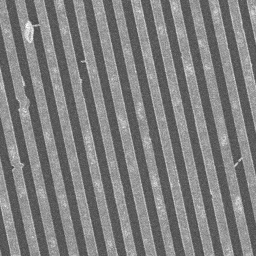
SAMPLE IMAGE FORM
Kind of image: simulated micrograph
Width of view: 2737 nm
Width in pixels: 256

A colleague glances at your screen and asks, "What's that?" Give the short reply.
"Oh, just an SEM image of parallel lines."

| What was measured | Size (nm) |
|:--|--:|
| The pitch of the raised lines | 202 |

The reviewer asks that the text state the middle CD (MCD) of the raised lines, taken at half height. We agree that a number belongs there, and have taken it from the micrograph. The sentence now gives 0.102 µm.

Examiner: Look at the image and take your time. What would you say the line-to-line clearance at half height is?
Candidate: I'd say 102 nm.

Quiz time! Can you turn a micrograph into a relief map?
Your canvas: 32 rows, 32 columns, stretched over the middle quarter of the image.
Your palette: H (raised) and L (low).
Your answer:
LHHLLLHHLLLHHLLLHHLLHHHLLHHLLLHH
LHHLLLHHLLLHHLLLHHLLLHHLLHHHLLHH
LHHHLLHHLLLHHLLLHHLLLHHLLLHHLLHH
LLHHLLLHHLLHHHLLHHLLLHHLLLHHLLLH
LLHHLLLHHLLHHHLLHHHLLHHLLLHHLLLH
LLHHLLLHHLLLHHLLLHHLLHHHLLHHHLLH
LLHHLLLHHLLLHHLLLHHLLLHHLLHHHLLH
LLHHHLLHHLLLHHLLLHHLLLHHLLLHHLLH
LLLHHLLLHHLLHHHLLHHLLLHHLLLHHLLL
LLLHHLLLHHLLHHHLLLHHLLHHLLLHHLLL
HLLHHLLLHHLLLHHLLLHHLLHHHLLHHHLL
HLLHHLLLHHLLLHHLLLHHLLLHHLLHHHLL
HLLLHHLLHHHLLHHLLLHHLLLHHLLLHHLL
HLLLHHLLLHHLLHHHLLHHLLLHHLLLHHLL
HLLLHHLLLHHLLHHHLLLHHLLHHHLLHHLL
HHLLHHLLLHHLLLHHLLLHHLLHHHLLHHHL
HHLLHHHLLHHLLLHHLLLHHLLLHHLLLHHL
HHLLLHHLLHHHLLHHLLLHHLLLHHLLLHHL
HHLLLHHLLLHHLLHHHLLHHLLLHHLLLHHL
HHHLLHHLLLHHLLLHHLLLHHLLHHHLLHHL
HHHLLHHLLLHHLLLHHLLLHHLLHHHLLHHH
LHHLLHHHLLHHLLLHHLLLHHLLLHHLLLHH
LHHLLLHHLLLHHLLHHHLLHHLLLHHLLLHH
LHHLLLHHLLLHHLLHHHLLHHHLLHHLLLHH
LHHHLLHHLLLHHLLLHHLLLHHLLHHHLLHH
LHHHLLHHLLLHHLLLHHLLLHHLLLHHLLLH
LLHHLLLHHLLHHHLLHHHLLHHLLLHHLLLH
LLHHLLLHHLLLHHLLHHHLLHHLLLHHLLLH
LLHHLLLHHLLLHHLLHHHLLLHHLLHHHLLH
LLHHHLLHHLLLHHLLLHHLLLHHLLHHHLLH
LLLHHLLHHHLLHHLLLHHLLLHHLLLHHLLH
LLLHHLLLHHLLHHHLLHHHLLHHLLLHHLLL